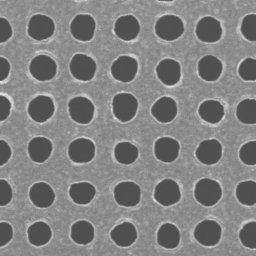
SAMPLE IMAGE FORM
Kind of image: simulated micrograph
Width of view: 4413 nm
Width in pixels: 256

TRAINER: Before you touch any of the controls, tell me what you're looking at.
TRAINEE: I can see a regular array of holes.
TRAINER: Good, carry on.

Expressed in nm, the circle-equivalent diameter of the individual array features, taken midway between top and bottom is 450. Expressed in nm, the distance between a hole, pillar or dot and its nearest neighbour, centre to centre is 683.